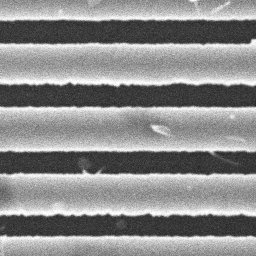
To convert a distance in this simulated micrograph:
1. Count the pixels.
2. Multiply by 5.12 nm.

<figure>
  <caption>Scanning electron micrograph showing lines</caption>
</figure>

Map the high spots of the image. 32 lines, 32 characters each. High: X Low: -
XXXXXXXXXXXXXXXXXXXXXXXXXXXXXXXX
XXXXXXXXXXXXXXXXXXXXXXXXXXXXXXXX
XXX-X-X--XXXX--X--XX--X---XXX---
--------------------------------
--------------------------------
-----------XX-XX---------------X
XXXXXXXXXXXXXXXXXXXXXXXXXXXXXXXX
XXXXXXXXXXXXXXXXXXXXXXXXXXXXXXXX
XXXXXXXXXXXXXXXXXXXXXXXXXXXXXXXX
XXXXXXXXXXXXXXXXXXXXXXXXXXXXXXXX
XXXXXXXX-XXXXXXXXXXXXX--X--XXXXX
--------------------------------
--------------------------------
XXXXXXXXXXXXXXXXXX-XXXXXXXXXXXXX
XXXXXXXXXXXXXXXXXXXXXXXXXXXXXXXX
XXXXXXXXXXXXXXXXXXXXXXXXXXXXXXXX
XXXXXXXXXXXXXXXXXXXXXXXXXXXXXXXX
XXXXXXXXXXXXXXXXXXXXXXXXXXXXXXXX
XXXXXXXXXXXXXXXXXXXXXXXXXXXXXXXX
--------------------------------
--------------------------------
--------------------------------
XXXXXXXXXXXXXXXXXXXXXXXXXXXXXXXX
XXXXXXXXXXXXXXXXXXXXXXXXXXXXXXXX
XXXXXXXXXXXXXXXXXXXXXXXXXXXXXXXX
XXXXXXXXXXXXXXXXXXXXXXXXXXXXXXXX
XXXXXXXXXXXXXXXXXXXXXXXXXXXXXXXX
--------------------------------
--------------------------------
--------------------------------
XXXXXXXXXXXXXXXXXXXXXXXXXXXXXXXX
XXXXXXXXXXXXXXXXXXXXXXXXXXXXXXXX